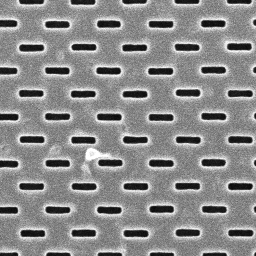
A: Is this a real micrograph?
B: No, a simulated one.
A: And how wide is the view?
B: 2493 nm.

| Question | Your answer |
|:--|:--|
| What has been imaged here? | a regular array of holes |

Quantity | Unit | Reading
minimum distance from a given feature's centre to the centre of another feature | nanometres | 334